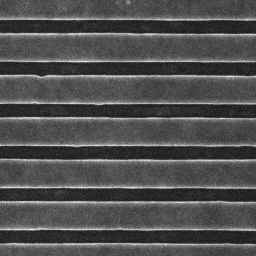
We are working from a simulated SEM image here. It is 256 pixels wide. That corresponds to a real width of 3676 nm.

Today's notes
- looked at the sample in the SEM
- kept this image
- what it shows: parallel lines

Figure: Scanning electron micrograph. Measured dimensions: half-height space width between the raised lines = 196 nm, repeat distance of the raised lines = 604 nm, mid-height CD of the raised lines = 28.4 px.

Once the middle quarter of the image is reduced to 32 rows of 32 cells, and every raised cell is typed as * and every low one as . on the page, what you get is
................................
................................
................................
********************************
********************************
********************************
********************************
********************************
********************************
********************************
................................
................................
................................
................................
********************************
********************************
********************************
********************************
********************************
********************************
..**............................
................................
................................
................................
********************************
********************************
********************************
********************************
********************************
********************************
********************************
................................